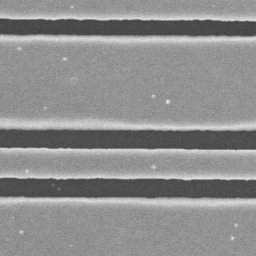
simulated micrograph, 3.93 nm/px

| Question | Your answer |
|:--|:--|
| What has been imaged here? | lines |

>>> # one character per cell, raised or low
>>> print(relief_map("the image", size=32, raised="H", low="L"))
HHHHHHHHHHHHHHHHHHHHHHHHHHHHHHHH
HHHHHHHHHHHHHHHHHHHHHHHHHHHHHHHH
LLLLLLLLLLLLLLLLLLLLLLLLLLLHHHHH
LLLLLLLLLLLLLLLLLLLLLLLLLLLLLLLL
HHHHHHHHHHHHHHHHLLHHHHHHLLHHHLLH
HHHHHHHHHHHHHHHHHHHHHHHHHHHHHHHH
HHHHHHHHHHHHHHHHHHHHHHHHHHHHHHHH
HHHHHHHHHHHHHHHHHHHHHHHHHHHHHHHH
HHHHHHHHHHHHHHHHHHHHHHHHHHHHHHHH
HHHHHHHHHHHHHHHHHHHHHHHHHHHHHHHH
HHHHHHHHHHHHHHHHHHHHHHHHHHHHHHHH
HHHHHHHHHHHHHHHHHHHHHHHHHHHHHHHH
HHHHHHHHHHHHHHHHHHHHHHHHHHHHHHHH
HHHHHHHHHHHHHHHHHHHHHHHHHHHHHHHH
HHHHHHHHHHHHHHHHHHHHHHHHHHHHHHHH
HHHHHHHHHHHHHHHHHHHHHHHHHHHHHHHH
LLLLLLLLLLLLLLLLLLLLLLLLLLLLLLLL
LLLLLLLLLLLLLLLLLLLLLLLLLLLLLLLL
LLLLLLLLLLLLLLLLLLLLLLLLLLLLLLLL
HHHHHHHHHHHHHHHHHHHHHHHHHHHHHHHH
HHHHHHHHHHHHHHHHHHHHHHHHHHHHHHHH
HHHHHHHHHHHHHHHHHHHHHHHHHHHHHHHH
LLLLLLLLLLLLLLLLLLLLLLLLLLLLLLLL
LLLLLLLLLLLLLLLLLLLLLLLLLLLLLLLL
LLLLLLLLLLLLLLLLLLLLLLLLLLLLLLLL
HHHHHHHHHHHHHHHHHHHHHHHHHHHHHHHH
HHHHHHHHHHHHHHHHHHHHHHHHHHHHHHHH
HHHHHHHHHHHHHHHHHHHHHHHHHHHHHHHH
HHHHHHHHHHHHHHHHHHHHHHHHHHHHHHHH
HHHHHHHHHHHHHHHHHHHHHHHHHHHHHHHH
HHHHHHHHHHHHHHHHHHHHHHHHHHHHHHHH
HHHHHHHHHHHHHHHHHHHHHHHHHHHHHHHH